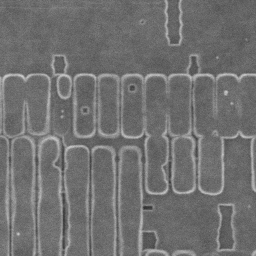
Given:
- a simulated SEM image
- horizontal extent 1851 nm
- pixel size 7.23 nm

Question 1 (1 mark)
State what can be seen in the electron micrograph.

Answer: wiring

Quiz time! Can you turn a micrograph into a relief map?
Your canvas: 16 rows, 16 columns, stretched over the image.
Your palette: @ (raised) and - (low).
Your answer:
----------------
----------------
----------------
----------------
----------------
@@@@@@@@@@@@@@@@
@@@--@@@@@@@@@@@
@@@--@@@@@@@@@@@
@@@--@--@@@@@@@@
@@@@@@@-@@@@@@--
@@@@@@@@@@@@@@--
@@@@@@@@@@@@@@--
@@@@@@@@@-------
@@@@@@@@@-------
@@@@@@@@@-------
@@@@@@@@@-------